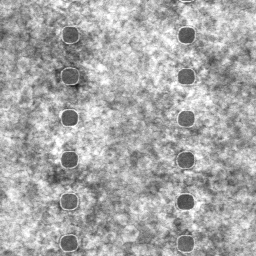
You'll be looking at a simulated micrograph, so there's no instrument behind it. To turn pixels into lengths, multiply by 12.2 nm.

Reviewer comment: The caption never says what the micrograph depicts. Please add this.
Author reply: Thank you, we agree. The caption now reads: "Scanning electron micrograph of a regular array of raised bodies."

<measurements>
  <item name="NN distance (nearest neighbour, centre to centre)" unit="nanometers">288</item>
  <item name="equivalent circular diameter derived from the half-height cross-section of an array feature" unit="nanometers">224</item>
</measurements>